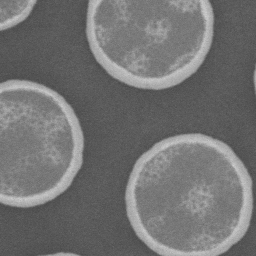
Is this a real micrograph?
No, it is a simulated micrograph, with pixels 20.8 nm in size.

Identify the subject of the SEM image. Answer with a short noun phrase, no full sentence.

raised bodies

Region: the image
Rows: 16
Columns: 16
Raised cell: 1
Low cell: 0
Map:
1100001111111000
1000001111111000
0000001111111000
0000001111111000
0000000111110000
1110000000000000
1111000000000000
1111100000000000
1111100000000000
1111100000111100
1111100001111110
1111000011111110
1110000011111111
0000000011111110
0000000001111110
0000000000111100